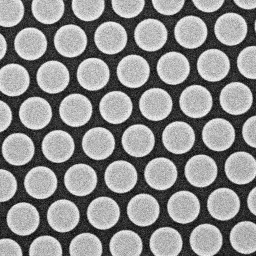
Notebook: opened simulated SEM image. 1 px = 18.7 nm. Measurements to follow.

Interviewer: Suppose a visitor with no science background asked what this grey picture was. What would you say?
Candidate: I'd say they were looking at an array of small figures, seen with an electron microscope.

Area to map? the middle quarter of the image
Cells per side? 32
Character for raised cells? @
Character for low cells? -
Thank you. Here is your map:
----@@@@@@@---@@@@@@@--@@@@@@@@-
@--@@@@@@@@--@@@@@@@@--@@@@@@@@-
@--@@@@@@@@--@@@@@@@@---@@@@@@@-
@--@@@@@@@@---@@@@@@@---@@@@@@@-
@---@@@@@@@---@@@@@@-----@@@@---
@----@@@@@------@@@-------------
-------@-------------@@@@-----@@
-----------@@@@-----@@@@@@---@@@
@@@@@@----@@@@@@---@@@@@@@@--@@@
@@@@@@---@@@@@@@@--@@@@@@@@--@@@
@@@@@@@--@@@@@@@@--@@@@@@@@--@@@
@@@@@@@--@@@@@@@@--@@@@@@@@---@@
@@@@@@@--@@@@@@@@---@@@@@@----@@
@@@@@@----@@@@@@-----@@@@-------
@@@@@@-----@@@@--------------@--
--@@-------------@@@------@@@@@-
------@@@@@-----@@@@@@---@@@@@@@
@----@@@@@@@---@@@@@@@---@@@@@@@
@@---@@@@@@@---@@@@@@@@--@@@@@@@
@@---@@@@@@@@--@@@@@@@@--@@@@@@@
@@---@@@@@@@@--@@@@@@@---@@@@@@@
@@---@@@@@@@---@@@@@@@----@@@@@-
@@----@@@@@@----@@@@@-----------
@------@@@----------------------
-------------@@@------@@@@@----@
--@@@@-----@@@@@@----@@@@@@@--@@
-@@@@@@----@@@@@@@--@@@@@@@@--@@
@@@@@@@@--@@@@@@@@--@@@@@@@@--@@
@@@@@@@@--@@@@@@@@--@@@@@@@@---@
@@@@@@@@--@@@@@@@@---@@@@@@@---@
@@@@@@@@---@@@@@@-----@@@@@-----
-@@@@@@-----@@@@@---------------